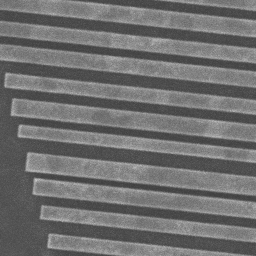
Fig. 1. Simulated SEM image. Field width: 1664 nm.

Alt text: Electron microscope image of parallel lines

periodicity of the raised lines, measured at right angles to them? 167 nm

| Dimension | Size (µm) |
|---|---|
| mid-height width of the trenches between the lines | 0.0695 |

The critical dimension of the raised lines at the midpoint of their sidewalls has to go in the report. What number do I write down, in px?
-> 15.3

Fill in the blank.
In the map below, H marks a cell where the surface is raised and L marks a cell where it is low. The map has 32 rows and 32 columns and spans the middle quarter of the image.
HHHHHHHHHHHHHHHHHHHHHHHHHHHHHHHH
LLLLLLLLLHHHHHHHHHHHHHHHHHHHHHHH
LLLLLLLLLLLLLLLLLLHHHHHHHHHHHHHH
LLLLLLLLLLLLLLLLLLLLLLLLLLLLHHHH
HHHHLLLLLLLLLLLLLLLLLLLLLLLLLLLL
HHHHHHHHHHHHHLLLLLLLLLLLLLLLLLLL
HHHHHHHHHHHHHHHHHHHHHHHHLLLLLLLL
LLLHHHHHHHHHHHHHHHHHHHHHHHHHHHHH
LLLLLLLLLLLLHHHHHHHHHHHHHHHHHHHH
LLLLLLLLLLLLLLLLLLLLHHHHHHHHHHHH
HHHHLLLLLLLLLLLLLLLLLLLLLLLLLHHH
HHHHHHHHHHHHHLLLLLLLLLLLLLLLLLLL
HHHHHHHHHHHHHHHHHHHHHHLLLLLLLLLL
HHHHHHHHHHHHHHHHHHHHHHHHHHHHHHHL
LLLLHHHHHHHHHHHHHHHHHHHHHHHHHHHH
LLLLLLLLLLLLHHHHHHHHHHHHHHHHHHHH
LLLLLLLLLLLLLLLLLLLLLHHHHHHHHHHH
HHHHHHHHHLLLLLLLLLLLLLLLLLLLLLHH
HHHHHHHHHHHHHHHHHHLLLLLLLLLLLLLL
LHHHHHHHHHHHHHHHHHHHHHHHHHHLLLLL
LLLLLLLLLLHHHHHHHHHHHHHHHHHHHHHH
LLLLLLLLLLLLLLLLLLLHHHHHHHHHHHHH
LLLLLLLLLLLLLLLLLLLLLLLLLLLLLHHH
HHHLLLLLLLLLLLLLLLLLLLLLLLLLLLLL
HHHHHHHHHHHHLLLLLLLLLLLLLLLLLLLL
HHHHHHHHHHHHHHHHHHHHHLLLLLLLLLLL
HHHHHHHHHHHHHHHHHHHHHHHHHHHHHHLL
HHHHHHHHHHHHHHHHHHHHHHHHHHHHHHHH
LLLLLLLLLHHHHHHHHHHHHHHHHHHHHHHH
LLLLLLLLLLLLLLLLLLHHHHHHHHHHHHHH
HHHHHHHHLLLLLLLLLLLLLLLLLLLHHHHH
HHHHHHHHHHHHHHHHHLLLLLLLLLLLLLLL